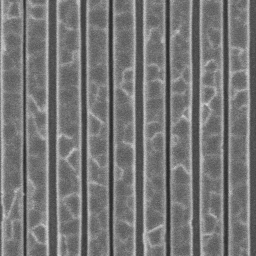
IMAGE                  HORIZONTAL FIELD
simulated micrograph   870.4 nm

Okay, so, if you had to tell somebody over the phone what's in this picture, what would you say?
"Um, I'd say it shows parallel lines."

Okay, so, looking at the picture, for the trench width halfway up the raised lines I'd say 5.76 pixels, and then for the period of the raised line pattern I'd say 96.7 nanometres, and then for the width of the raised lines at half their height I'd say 74.9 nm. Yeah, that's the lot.